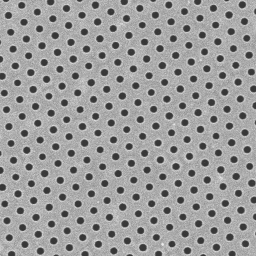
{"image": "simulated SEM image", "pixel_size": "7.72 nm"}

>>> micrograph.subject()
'a regular array of holes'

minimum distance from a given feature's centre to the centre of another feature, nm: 128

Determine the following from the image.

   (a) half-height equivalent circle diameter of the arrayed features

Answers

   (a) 0.0558 µm